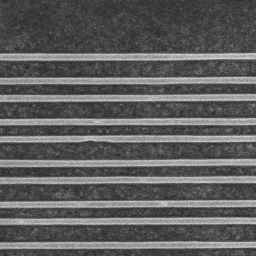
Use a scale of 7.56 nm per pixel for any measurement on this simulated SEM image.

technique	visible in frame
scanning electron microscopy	parallel lines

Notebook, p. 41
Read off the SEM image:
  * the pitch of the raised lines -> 158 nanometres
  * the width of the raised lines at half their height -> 43.5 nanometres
